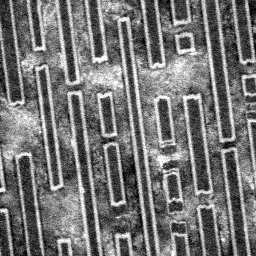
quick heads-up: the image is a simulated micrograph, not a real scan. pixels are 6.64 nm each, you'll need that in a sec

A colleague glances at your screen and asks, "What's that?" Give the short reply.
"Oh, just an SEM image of parallel lines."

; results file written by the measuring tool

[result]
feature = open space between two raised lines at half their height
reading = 108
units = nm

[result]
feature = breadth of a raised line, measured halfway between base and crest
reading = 83.9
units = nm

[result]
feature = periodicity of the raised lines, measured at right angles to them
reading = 0.194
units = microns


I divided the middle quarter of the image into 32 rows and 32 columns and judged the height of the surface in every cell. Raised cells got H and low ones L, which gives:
HHHLLLLLLLLLLLLHHHLLLLHLLLLLLLLL
HHHLLLLLLLLLLLLHHHLLLLLLLLLLLLLL
HHHLLLLLLLLLLLLHHHLLLLLLLLLLLLLL
LHHLLLLLLLLLLLLLHHLLLLLLLLLLLLLL
LHHLLLLLLLLLLLLLHHLLLLLLLLLLLLLL
LLLLLLLLLLLLLLLLHHLLLLLLLLLLLLLL
LLLLLLLLLLLLLLLLHHLLLLLLLLLLLLLL
LHHHLLLLLLLLLLLLHHLLLLLLLLLLLLLL
LHHHLLLLLHHHLLLLHHHLLLLLHHLLLLHH
LHHHLLLLLHHHLLLLHHHLLLLHHHLLLLHH
LLHHLLLLLHHHLLLLHHHLLLLHHHLLLLHH
LLHHHLLLLHHHLLLLLHHLLLLHHHLLLLHH
LLHHHLLLLHHHLLLLLHHLLLLHHHHLLLLH
LLHHHLLLLHHHLLLLLHHLLLLHHHHLLLLH
LLHHHLLLLLHHHLLLLHHLLLLLHHHLLLLH
LLHHHLLLLLHHHLLLLHHLLLLLHHHLLLLH
LLHHHLLLLLHHHLLLLHHHLLLLHHHLLLLH
LLHHHLLLLLHHHLLLLHHHLLLLHHHLLLLH
LLLHHHLLLLLLLLLLLHHHLLLLHHHLLLLH
LLLHHHLLLLLLLLLLLLHHLLLLHLLLLLLH
LLLHHHLLLLHHHLLLLLHHLLLLLLLLLLLL
LLLHHHLLLLHHHLLLLLHHLLLLLLLLLLLL
LLLHHHLLLLLHHHLLLLHHLLLLLLLLLLLL
LLLHHHLLLLLHHHLLLLHHLLLLLLLLLLLL
LLLHHHLLLLLHHHLLLLHHHLLLLLLLLLLL
LLLHHHLLLLLHHHLLLLHHHLLLLLLLLLLL
LLLLHHHLLLLHHHLLLLLHHLLLLLLLLLLL
LLLLHHHLLLLHHHLLLLLHHLLLLLHHLLLL
LLLLHHHLLLLHHHLLLLLHHLLLLHHHHLLL
LLLLHHHLLLLHHHLLLLLHHLLLLHHHHLLL
LLLLHHHLLLLLHHHLLLLHHLLLLLHHHLLL
LLLLHHHLLLLLHHHLLLLHHLLLLLHHHLLL